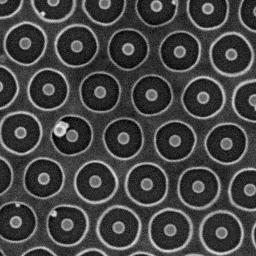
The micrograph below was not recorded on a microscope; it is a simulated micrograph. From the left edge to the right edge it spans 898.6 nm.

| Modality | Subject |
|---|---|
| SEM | an array of small figures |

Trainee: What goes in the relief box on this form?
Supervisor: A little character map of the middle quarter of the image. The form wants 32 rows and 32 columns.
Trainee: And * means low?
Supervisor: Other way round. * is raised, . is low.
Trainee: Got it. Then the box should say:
**..**********....********......
***************************....*
*******....*********************
******......********....********
.****........*****........******
.***..........****........*****.
.***....**....***..........***..
.***....**....***....**....***..
.***..........***....**....***..
*****........****..........***..
******.......*****........****..
*******....*******.......******.
********************..**********
....****************************
......******......*********..***
*.....*****........******......*
.......***.........*****........
.**....***....**...****.........
.**....***....**....***....**...
.......***....**....***....**...
......*****........****.........
.....******........****.........
...*********......******.......*
**************..*********.....**
********.***********************
*****......*******.....*********
****........*****.......*******.
***.........****.........*****..
***....**....***..........***...
***....**....***....**....***...
***....**....***...***....***...
***..........***..........***...